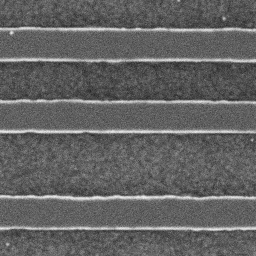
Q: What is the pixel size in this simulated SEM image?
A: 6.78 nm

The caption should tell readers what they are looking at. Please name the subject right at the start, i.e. lines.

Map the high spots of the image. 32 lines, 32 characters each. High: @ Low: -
--------------------------------
--------------------------------
--------------------------------
--@@@---------------------------
@@@@@@@@@@@@@@@@@@@@@@@@@@@@@@@@
@@@@@@@@@@@@@@@@@@@@@@@@@@@@@@@@
@@@@@@@@@@@@@@@@@@@@@@@@@@@@@@@@
@@@@@@@@@@@@@@@@@@@@@@@@@@@@@@@@
--------------------------------
--------------------------------
--------------------------------
--------------------------------
--------------------------------
@@@@@@@@@@@@@@@@@@@@@@@@@@@@@@@@
@@@@@@@@@@@@@@@@@@@@@@@@@@@@@@@@
@@@@@@@@@@@@@@@@@@@@@@@@@@@@@@@@
@@@@@@@@@@@@@@@@@@@@@@@@@@@@@@@@
--------------------------------
--------------------------------
--------------------------------
--------------------------------
--------------------------------
--------------------------------
--------------------------------
@@@@@@@@------@--@--@@----------
@@@@@@@@@@@@@@@@@@@@@@@@@@@@@@@@
@@@@@@@@@@@@@@@@@@@@@@@@@@@@@@@@
@@@@@@@@@@@@@@@@@@@@@@@@@@@@@@@@
@@@@@@@@@@@@@@@@@@@@@@@@@@@@@@@@
--------------------------------
--------------------------------
--------------------------------